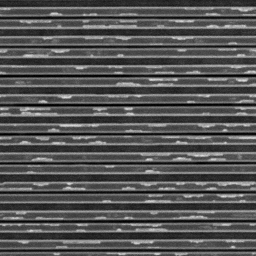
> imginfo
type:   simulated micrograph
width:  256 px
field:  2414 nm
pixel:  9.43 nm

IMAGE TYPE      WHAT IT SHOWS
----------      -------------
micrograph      parallel lines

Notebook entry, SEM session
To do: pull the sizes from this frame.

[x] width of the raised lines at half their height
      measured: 82.5 nm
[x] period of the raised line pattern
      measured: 137 nanometers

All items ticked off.